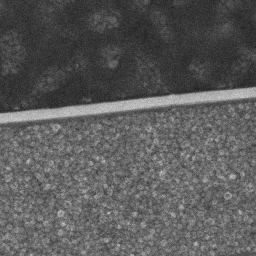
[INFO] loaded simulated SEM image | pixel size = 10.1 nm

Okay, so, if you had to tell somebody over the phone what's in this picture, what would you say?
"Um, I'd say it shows one or a few lines or trenches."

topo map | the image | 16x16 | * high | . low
................
................
................
................
................
................
.........*******
****************
****************
****************
****************
****************
****************
****************
****************
****************